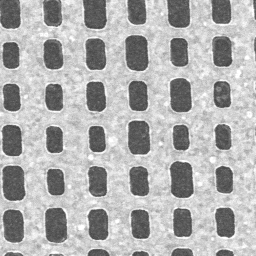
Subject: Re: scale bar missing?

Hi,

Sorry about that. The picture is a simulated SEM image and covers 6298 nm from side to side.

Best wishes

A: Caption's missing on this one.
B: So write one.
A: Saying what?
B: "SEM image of a regular array of holes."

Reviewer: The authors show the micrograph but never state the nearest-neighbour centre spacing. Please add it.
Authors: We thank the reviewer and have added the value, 1030 nm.